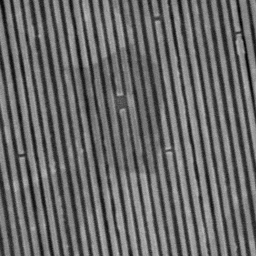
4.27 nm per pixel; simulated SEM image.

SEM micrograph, parallel lines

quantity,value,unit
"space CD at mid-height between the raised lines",21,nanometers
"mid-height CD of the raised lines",21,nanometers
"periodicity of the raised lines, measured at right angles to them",0.0415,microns